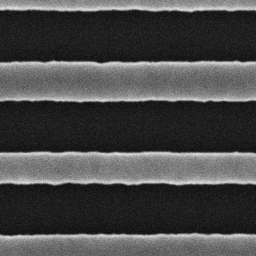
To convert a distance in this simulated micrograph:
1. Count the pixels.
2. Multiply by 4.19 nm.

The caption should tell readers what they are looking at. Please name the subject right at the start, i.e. lines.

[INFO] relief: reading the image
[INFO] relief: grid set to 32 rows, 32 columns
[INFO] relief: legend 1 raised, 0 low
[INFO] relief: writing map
11111111111111111111111111111111
00000000000000000000000000000000
00000000000000000000000000000000
00000000000000000000000000000000
00000000000000000000000000000000
00000000000000000000000000000000
00000000000000000000000000000000
00000000000000000000000000000000
11111111111111111111111111111111
11111111111111111111111111111111
11111111111111111111111111111111
11111111111111111111111111111111
10111011111111111110010011111110
00000000000000000000000000000000
00000000000000000000000000000000
00000000000000000000000000000000
00000000000000000000000000000000
00000000000000000000000000000000
00000000000000000000000000000000
11111111111111111111111111111111
11111111111111111111111111111111
11111111111111111111111111111111
11111111111111111111111111111111
00000000000000000000000000000000
00000000000000000000000000000000
00000000000000000000000000000000
00000000000000000000000000000000
00000000000000000000000000000000
00000000000000000000000000000000
10101111111111111111111111111111
11111111111111111111111111111111
11111111111111111111111111111111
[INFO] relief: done